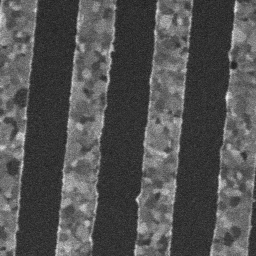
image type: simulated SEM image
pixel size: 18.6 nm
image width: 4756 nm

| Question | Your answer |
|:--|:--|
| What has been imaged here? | one or a few lines or trenches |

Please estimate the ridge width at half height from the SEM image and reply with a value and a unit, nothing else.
634 nanometers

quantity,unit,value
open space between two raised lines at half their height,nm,805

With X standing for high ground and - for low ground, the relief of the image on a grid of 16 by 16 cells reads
XX---XX---XX---X
XX---XX---XX---X
XX---XX---XX---X
XX---XX---XX--XX
XX---XX--XXX--XX
XX--XXX--XXX--XX
XX--XXX--XX---XX
XX--XX---XX---XX
XX--XX---XX---XX
X---XX---XX---XX
X---XX---XX---XX
X---XX---XX---XX
X---XX---XX---XX
X---XX---XX---XX
X---XX---XX--XXX
X---XX--XXX--XX-